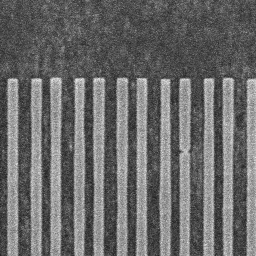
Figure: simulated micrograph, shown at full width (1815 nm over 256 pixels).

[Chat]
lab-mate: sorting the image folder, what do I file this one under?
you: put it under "parallel lines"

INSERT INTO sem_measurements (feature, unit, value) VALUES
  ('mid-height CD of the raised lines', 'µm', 0.0692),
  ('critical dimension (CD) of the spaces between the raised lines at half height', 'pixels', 12.3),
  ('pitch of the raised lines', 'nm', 153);